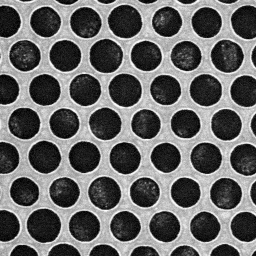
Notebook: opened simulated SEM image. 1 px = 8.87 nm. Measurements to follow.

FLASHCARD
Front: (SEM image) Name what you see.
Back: a regular array of holes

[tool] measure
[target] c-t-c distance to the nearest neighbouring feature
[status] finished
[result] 346 nanometers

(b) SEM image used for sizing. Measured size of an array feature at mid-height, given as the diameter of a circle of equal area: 284 nm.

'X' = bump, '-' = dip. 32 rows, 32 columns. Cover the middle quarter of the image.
----XXX-------XXXX------XXX-----
---XXXXX-----XXXXXX----XXXXXX---
XXXX--XXXXXXXX--XXXXXXXXX-XXXXXX
XX------XXXX------XXXXX-----XXXX
XX-------XX--------XXX-------XXX
X--------XX---------XX-------XX-
X--------XX---------X--------XX-
X--------XX---------XX-------XX-
XX-------XX--------XXX-------XXX
XXX-----XXXX-------XXXX-----XXXX
XXXXX-XXXXXXX-----XXXXXXX-XXXXXX
--XXXXXX-----XXXXXX---XXXXXXX---
---XXXX-------XXXX-----XXXXX----
----XX--------XXX-------XXX-----
----XX---------XX-------XXX-----
----XX---------XX-------XXX-----
----XX--------XXX-------XXX-----
---XXXX-------XXXX-----XXXXX----
--XXXXXX-----XXXXXX---XXXXXXX---
XXXX--XXXXXXXXX-XXXXXXXXX-XXXXXX
XX------XXXXX-----XXXXX-----XXXX
X--------XXX-------XXX-------XXX
X--------XX--------XXX-------XXX
X--------XX--------XX--------XXX
X--------XX--------XXX-------XXX
XX-------XXX-------XXX-------XXX
XXX-----XXXXX-----XXXXX-----XXXX
XXXXXXXXXXXXXXX--XXXXXXXXXXXXXXX
-XXXXXXX----XXXXXXX--XXXXXXXX--X
---XXXX------XXXX------XXXXX----
----XX--------XXX-------XXX-----
----XX--------XX--------XXX-----